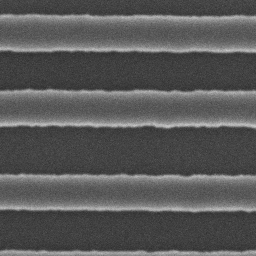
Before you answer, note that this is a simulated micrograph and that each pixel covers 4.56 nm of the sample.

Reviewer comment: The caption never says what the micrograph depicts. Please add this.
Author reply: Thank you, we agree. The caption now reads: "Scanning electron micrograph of lines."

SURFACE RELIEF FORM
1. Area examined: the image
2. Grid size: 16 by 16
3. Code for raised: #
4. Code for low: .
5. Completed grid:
................
################
################
................
................
................
################
################
................
................
................
################
################
................
................
................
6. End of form